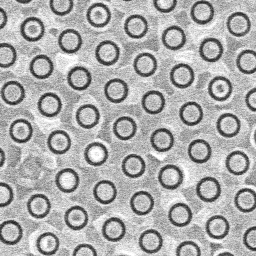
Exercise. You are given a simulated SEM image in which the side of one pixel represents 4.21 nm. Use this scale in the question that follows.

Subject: a regular array of ring-shaped grooves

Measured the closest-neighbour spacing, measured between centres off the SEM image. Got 0.161 um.